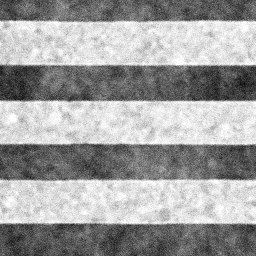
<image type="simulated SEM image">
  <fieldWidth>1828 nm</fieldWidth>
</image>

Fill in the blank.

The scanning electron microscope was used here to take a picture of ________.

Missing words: one or a few lines or trenches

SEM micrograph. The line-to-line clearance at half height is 269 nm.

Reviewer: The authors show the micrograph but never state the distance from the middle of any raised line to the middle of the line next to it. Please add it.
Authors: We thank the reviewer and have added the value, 567 nm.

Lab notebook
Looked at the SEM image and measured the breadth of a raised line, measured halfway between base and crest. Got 301 nanometres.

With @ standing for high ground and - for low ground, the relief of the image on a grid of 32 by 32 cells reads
--------------------------------
--------------------------------
--------------------------------
@@@@@@@@@@@@@@@@@@@@@@@@@@@@@@@@
@@@@@@@@@@@@@@@@@@@@@@@@@@@@@@@@
@@@@@@@@@@@@@@@@@@@@@@@@@@@@@@@@
@@@@@@@@@@@@@@@@@@@@@@@@@@@@@@@@
@@@@@@@@@@@@@@@@@@@@@@@@@@@@@@@@
--------------------------------
--------------------------------
--------------------------------
--------------------------------
--------------------------------
@@@@@@@@@@@@@@@@@@@@@@@@@@@@@@@@
@@@@@@@@@@@@@@@@@@@@@@@@@@@@@@@@
@@@@@@@@@@@@@@@@@@@@@@@@@@@@@@@@
@@@@@@@@@@@@@@@@@@@@@@@@@@@@@@@@
@@@@@@@@@@@@@@@@@@@@@@@@@@@@@@@@
--------------------------------
--------------------------------
--------------------------------
--------------------------------
--------------------------------
@@@@@@@@@@@@@@@@@@@@@@@@@@@@@@@@
@@@@@@@@@@@@@@@@@@@@@@@@@@@@@@@@
@@@@@@@@@@@@@@@@@@@@@@@@@@@@@@@@
@@@@@@@@@@@@@@@@@@@@@@@@@@@@@@@@
@@@@@@@@@@@@@@@@@@@@@@@@@@@@@@@@
--------------------------------
--------------------------------
--------------------------------
--------------------------------